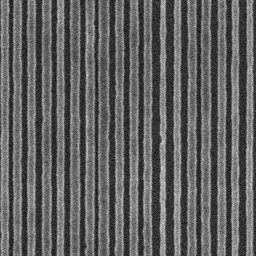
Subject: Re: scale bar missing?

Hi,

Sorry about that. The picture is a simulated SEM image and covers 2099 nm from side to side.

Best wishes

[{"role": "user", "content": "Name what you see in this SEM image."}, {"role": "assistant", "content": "parallel lines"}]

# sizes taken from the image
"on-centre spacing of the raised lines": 0.118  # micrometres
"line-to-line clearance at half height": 56.4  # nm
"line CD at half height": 7.62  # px